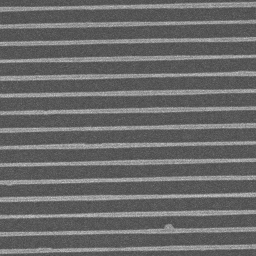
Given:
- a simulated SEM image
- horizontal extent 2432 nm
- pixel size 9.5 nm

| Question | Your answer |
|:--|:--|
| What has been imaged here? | parallel lines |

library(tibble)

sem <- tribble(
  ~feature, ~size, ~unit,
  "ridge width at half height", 24.9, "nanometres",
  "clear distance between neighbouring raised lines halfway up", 133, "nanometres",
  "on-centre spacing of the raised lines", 164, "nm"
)